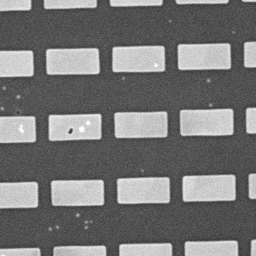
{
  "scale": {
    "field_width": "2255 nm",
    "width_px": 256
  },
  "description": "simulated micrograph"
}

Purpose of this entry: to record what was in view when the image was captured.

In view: an array of small figures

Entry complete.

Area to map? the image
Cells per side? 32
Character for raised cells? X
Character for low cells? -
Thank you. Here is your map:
XXXX--XXXXXX--XXXXXX------------
--------------------------------
--------------------------------
--------------------------------
--------------------------------
-------------------------------X
XXXX--XXXXXX--XXXXXX--XXXXXXX--X
XXXX--XXXXXX--XXXXXX--XXXXXXX--X
XXXX--XXXXXX--XXXXXXX--XXXXX----
XX------------------------------
--------------------------------
--------------------------------
--------------------------------
--------------------------------
-------XXXXX--XXXXXXX--XXXXXX--X
XXXX--XXXXXXX-XXXXXXX--XXXXXX--X
XXXX--XXXXXXX-XXXXXXX--XXXXXX--X
XXXX----------------------------
--------------------------------
--------------------------------
--------------------------------
--------------------------------
---------------XXXXXX--XXXXXX--X
XXXXX-XXXXXXX--XXXXXX--XXXXXX--X
XXXXX--XXXXXX--XXXXXX--XXXXXX--X
XXXXX--XXXXXX-------------------
--------------------------------
--------------------------------
--------------------------------
--------------------------------
--------------------X--XXXXXXX-X
XXXXX--XXXXXX--XXXXXX--XXXXXXX-X